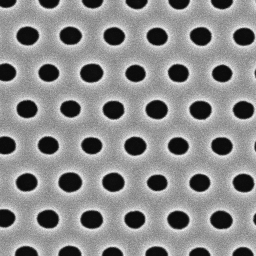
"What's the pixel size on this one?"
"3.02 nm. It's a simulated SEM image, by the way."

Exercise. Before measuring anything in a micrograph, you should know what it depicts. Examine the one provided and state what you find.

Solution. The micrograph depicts a regular array of holes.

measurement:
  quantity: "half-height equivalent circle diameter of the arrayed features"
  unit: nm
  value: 60.3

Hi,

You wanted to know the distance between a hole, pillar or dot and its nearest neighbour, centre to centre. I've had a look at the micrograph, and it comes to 128 nm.